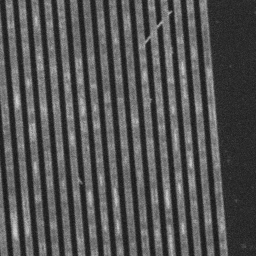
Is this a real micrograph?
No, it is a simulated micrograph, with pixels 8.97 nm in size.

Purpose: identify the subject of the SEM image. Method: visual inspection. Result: parallel lines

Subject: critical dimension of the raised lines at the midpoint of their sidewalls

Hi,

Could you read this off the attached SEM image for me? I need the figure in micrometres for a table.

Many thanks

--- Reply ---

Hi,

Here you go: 0.0625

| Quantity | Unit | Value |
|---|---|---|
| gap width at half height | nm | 54.7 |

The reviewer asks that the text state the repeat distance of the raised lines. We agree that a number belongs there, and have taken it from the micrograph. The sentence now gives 0.116 um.